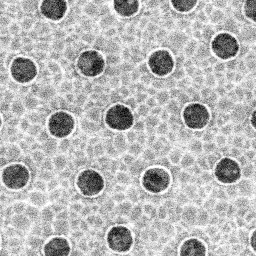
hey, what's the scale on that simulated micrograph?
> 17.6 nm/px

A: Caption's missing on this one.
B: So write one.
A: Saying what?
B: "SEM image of a regular array of raised bodies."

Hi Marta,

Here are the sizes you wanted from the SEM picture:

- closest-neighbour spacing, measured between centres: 1120 nm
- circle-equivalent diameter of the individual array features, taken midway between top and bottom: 508 nm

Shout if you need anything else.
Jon